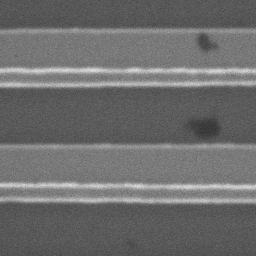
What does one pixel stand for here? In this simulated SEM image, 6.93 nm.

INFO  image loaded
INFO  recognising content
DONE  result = lines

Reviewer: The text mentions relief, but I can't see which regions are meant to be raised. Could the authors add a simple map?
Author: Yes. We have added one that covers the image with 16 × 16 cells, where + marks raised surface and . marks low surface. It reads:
................
................
++++++++++++++++
++++++++++++++++
++++++++++++++++
................
................
................
................
++++++++++++++++
++++++++++++++++
++++++++++++++++
++++++++++++++++
................
................
................